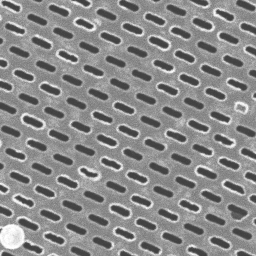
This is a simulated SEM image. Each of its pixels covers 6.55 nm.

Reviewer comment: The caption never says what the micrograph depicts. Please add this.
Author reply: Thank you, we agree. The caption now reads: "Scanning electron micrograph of a regular array of holes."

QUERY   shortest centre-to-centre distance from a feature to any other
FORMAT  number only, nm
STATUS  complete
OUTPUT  153